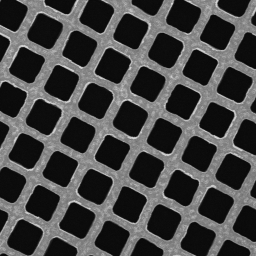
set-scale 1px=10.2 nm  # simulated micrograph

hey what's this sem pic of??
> a regular array of holes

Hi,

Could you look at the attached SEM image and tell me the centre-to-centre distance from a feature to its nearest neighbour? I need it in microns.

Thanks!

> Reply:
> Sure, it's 0.389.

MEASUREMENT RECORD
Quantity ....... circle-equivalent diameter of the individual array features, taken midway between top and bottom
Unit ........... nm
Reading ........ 330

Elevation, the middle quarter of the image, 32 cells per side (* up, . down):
****.***........*********..***..
.*******........***...********..
...*****.......***......******..
....******.....***.......******.
....********..***........*******
...***...********........***..**
...**......******.......***.....
..***.......******......***.....
.***........********...***......
****........***..*********......
***........***.....******.......
****.......***......******......
******....***........******.....
**.*****..***........********..*
*....*******........***....*****
*......*****........**......****
........******.....***.......***
........********...**........***
.......***...********........***
.......**......******.......***.
*.....***.......******......***.
***...**........*******....***..
********........***..*****.***..
..******.......***.....******...
...******......***.......*****..
...*******....***........*******
...***..****..***........*******
..***.....******........***...**
..***.......*****.......***.....
.***........******.....***......
.***........********...***......
***........***....*******.......